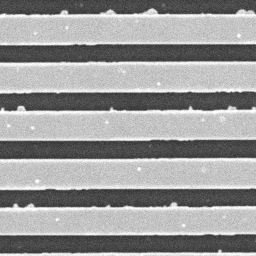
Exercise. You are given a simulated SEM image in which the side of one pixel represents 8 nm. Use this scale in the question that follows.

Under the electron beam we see lines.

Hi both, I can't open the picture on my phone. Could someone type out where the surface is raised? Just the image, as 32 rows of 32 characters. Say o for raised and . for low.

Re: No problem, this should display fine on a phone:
................................
................................
oooooooooooooooooooooooooooooooo
oooooooooooooooooooooooooooooooo
oooooooooooooooooooooooooooooooo
ooooooooo.......................
................................
................................
oooooooooooooooooooooooooooooooo
oooooooooooooooooooooooooooooooo
oooooooooooooooooooooooooooooooo
o...............................
................................
................................
oooooooooooooooooooooooooooooooo
oooooooooooooooooooooooooooooooo
oooooooooooooooooooooooooooooooo
ooooooooooooooooooo...o.........
................................
................................
oooooooooooooooooooooooooooooooo
oooooooooooooooooooooooooooooooo
oooooooooooooooooooooooooooooooo
ooooooooooooooooooooooooooooooo.
................................
................................
oooooooooooooooooooooooooooooooo
oooooooooooooooooooooooooooooooo
oooooooooooooooooooooooooooooooo
................................
................................
................................